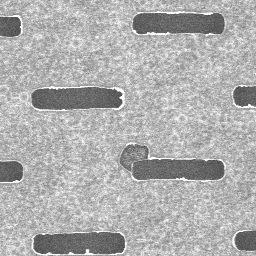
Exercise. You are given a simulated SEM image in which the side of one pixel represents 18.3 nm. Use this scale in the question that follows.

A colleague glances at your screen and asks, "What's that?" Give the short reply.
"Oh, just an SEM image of holes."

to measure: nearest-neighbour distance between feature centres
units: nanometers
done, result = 2110